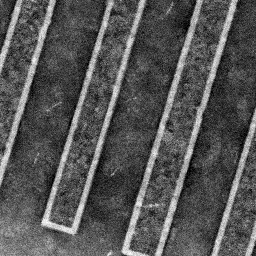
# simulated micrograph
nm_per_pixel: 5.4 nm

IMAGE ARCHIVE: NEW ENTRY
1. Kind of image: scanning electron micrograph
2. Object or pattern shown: one or a few lines or trenches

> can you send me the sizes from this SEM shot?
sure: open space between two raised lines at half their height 54.7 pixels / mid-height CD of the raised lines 174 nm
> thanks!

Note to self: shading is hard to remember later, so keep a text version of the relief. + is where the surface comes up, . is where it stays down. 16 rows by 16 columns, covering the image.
.++....++...+++.
.++....++...++..
+++...++....++..
++....++...+++..
++....++...++...
++...++....++...
+....++....++...
+....++...++....
+...++....++....
....++....++...+
....++...+++...+
...++....++....+
...++....++...++
...++...+++...++
........++....++
........++...+++